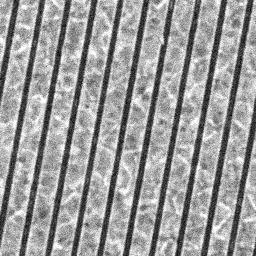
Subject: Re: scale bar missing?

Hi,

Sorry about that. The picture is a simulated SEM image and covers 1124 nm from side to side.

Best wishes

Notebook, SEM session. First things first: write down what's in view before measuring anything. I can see parallel lines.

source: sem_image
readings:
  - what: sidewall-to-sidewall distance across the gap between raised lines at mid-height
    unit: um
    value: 0.0335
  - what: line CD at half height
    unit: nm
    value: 80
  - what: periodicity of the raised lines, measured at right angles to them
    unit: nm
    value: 112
